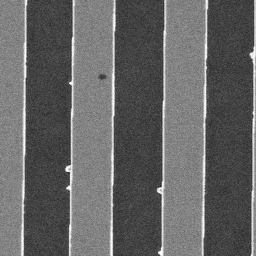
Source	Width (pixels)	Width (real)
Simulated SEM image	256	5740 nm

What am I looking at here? lines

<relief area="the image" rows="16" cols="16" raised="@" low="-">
@@---@@---@@@---
@@---@@---@@@---
@@---@@---@@@---
@@---@@---@@@---
@@---@@---@@@---
@@---@@---@@@---
@@---@@---@@@---
@@--@@@---@@@---
@@--@@@---@@@---
@@--@@@---@@@---
@---@@@---@@@---
@---@@@---@@@---
@---@@@---@@@---
@---@@@---@@@---
@---@@@---@@@---
@---@@@---@@@---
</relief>